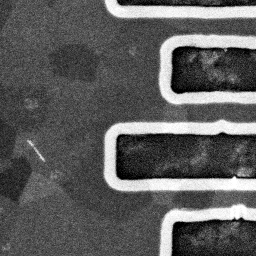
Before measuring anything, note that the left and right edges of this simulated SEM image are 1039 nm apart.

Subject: one or a few lines or trenches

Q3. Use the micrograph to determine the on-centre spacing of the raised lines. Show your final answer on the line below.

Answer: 346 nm